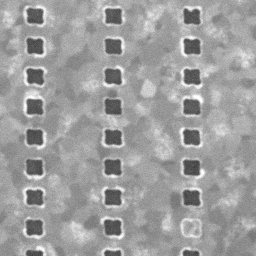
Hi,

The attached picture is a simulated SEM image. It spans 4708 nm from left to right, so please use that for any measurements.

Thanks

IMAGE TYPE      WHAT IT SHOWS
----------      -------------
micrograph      a regular array of holes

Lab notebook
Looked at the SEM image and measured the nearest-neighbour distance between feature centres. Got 556 nanometres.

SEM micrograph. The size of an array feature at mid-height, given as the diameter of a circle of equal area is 0.35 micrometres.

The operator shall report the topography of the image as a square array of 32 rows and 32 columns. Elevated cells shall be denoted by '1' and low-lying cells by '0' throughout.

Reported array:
11111111111111111111111111111111
11100111111110011111111001111111
11100111111110011111111001111111
11111111111111111111111111111111
11111111111111111111111111111111
11100111111110011111111001111111
11100111111110011111111001111111
11111111111111111111111111111111
11111111111111111111111111111111
11100111111110011111111001111111
11110111111110011111111001111111
11111111111111111111111111111111
11100111111110011111111001111111
11100111111110011111111001111111
11111111111111111111111111111111
11111111111111111111111111111111
11100111111110011111111001111111
11100111111110011111111001111111
11111111111111111111111111111111
11111111111111111111111111111111
11100111111110011111111001111111
11100111111110011111111001111111
11111111111111111111111111111111
11111111111111111111111111111111
11100111111110011111111001111111
11100111111110011111111001111111
11111111111111111111111111111111
11100111111110011111111111111111
11100111111110011111111001111111
11111111111111111111111001111111
11111111111111111111111111111111
11100111111110011111111001111111